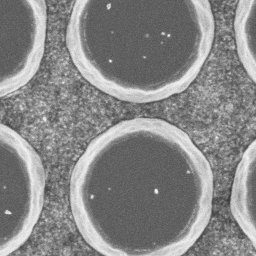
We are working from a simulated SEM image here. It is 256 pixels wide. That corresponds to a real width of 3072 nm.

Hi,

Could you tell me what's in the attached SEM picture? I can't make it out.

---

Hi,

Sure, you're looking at raised bodies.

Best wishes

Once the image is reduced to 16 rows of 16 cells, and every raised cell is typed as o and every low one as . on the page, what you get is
oo...oooooooo..o
ooo..oooooooo..o
ooo..oooooooo..o
oo...oooooooo..o
oo....oooooo....
.......oooo.....
................
................
o......oooo.....
oo....oooooo....
oo...oooooooo..o
oo...oooooooo..o
oo...oooooooo..o
oo...oooooooo..o
oo....oooooo....
o.....ooooo.....